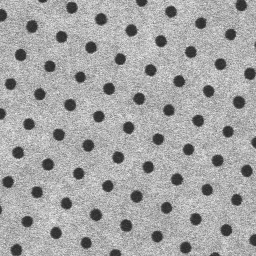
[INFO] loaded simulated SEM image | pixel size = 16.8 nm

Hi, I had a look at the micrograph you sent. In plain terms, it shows a regular array of holes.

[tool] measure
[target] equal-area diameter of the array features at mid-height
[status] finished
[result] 207 nanometres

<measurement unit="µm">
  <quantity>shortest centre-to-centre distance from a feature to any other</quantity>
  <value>0.512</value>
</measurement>